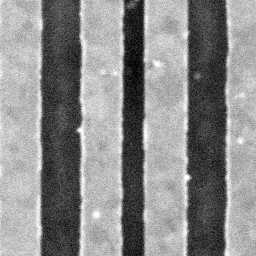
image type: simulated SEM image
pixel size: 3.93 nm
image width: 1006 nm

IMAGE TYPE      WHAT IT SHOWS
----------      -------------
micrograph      lines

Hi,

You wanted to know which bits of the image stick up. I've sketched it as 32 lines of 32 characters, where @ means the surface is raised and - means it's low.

@@@@@-----@@@@@---@@@@@-----@@@@
@@@@@-----@@@@@---@@@@@-----@@@@
@@@@@-----@@@@@---@@@@@-----@@@@
@@@@@-----@@@@@---@@@@@------@@@
@@@@@-----@@@@@---@@@@@------@@@
@@@@@-----@@@@@---@@@@@------@@@
@@@@@-----@@@@@---@@@@@------@@@
@@@@@-----@@@@@---@@@@@-----@@@@
@@@@@-----@@@@@---@@@@@-----@@@@
@@@@@-----@@@@@---@@@@@-----@@@@
@@@@@-----@@@@@---@@@@@-----@@@@
@@@@@-----@@@@@---@@@@@-----@@@@
@@@@@-----@@@@@---@@@@@-----@@@@
@@@@@-----@@@@@---@@@@@-----@@@@
@@@@@-----@@@@@---@@@@@-----@@@@
@@@@@-----@@@@@---@@@@@-----@@@@
@@@@@-----@@@@@---@@@@@-----@@@@
@@@@@-----@@@@@---@@@@@-----@@@@
@@@@@-----@@@@@---@@@@@-----@@@@
@@@@@-----@@@@@---@@@@@-----@@@@
@@@@@-----@@@@@---@@@@@-----@@@@
@@@@@-----@@@@@---@@@@@-----@@@@
@@@@@-----@@@@@---@@@@@-----@@@@
@@@@@-----@@@@@---@@@@@-----@@@@
@@@@@-----@@@@@---@@@@@-----@@@@
@@@@@-----@@@@@---@@@@@-----@@@@
@@@@@-----@@@@@---@@@@@-----@@@@
@@@@@-----@@@@@---@@@@@-----@@@@
@@@@@-----@@@@@---@@@@@-----@@@@
@@@@@-----@@@@@---@@@@@-----@@@@
@@@@@-----@@@@@---@@@@@-----@@@@
@@@@@-----@@@@@---@@@@@-----@@@@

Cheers